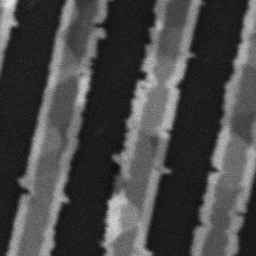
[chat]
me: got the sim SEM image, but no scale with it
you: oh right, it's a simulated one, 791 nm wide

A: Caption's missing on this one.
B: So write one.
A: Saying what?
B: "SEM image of one or a few lines or trenches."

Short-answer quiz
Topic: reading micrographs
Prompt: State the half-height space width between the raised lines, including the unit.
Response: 174 nm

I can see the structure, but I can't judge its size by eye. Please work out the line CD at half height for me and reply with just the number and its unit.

0.102 micrometres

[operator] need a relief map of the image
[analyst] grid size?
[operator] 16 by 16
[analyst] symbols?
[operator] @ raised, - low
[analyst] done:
@---@@----@@----
----@@----@@----
----@@----@@---@
----@@---@@@---@
---@@----@@----@
---@@----@@---@@
---@@----@@---@@
---@@---@@@---@@
--@@@---@@----@@
--@@----@@----@@
--@@----@@----@@
--@@----@@---@@-
--@@---@@----@@-
-@@----@@----@@-
-@@----@@----@@-
-@@----@@---@@--